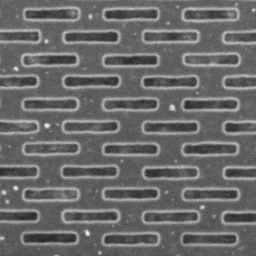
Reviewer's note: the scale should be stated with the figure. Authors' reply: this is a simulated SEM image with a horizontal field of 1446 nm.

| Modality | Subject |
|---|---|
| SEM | a regular array of holes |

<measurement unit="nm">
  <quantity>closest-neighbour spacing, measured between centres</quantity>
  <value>252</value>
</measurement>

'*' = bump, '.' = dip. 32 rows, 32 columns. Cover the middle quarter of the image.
***********.....****************
********************************
********************************
..............******............
..............******............
*.....**.....*******............
********************************
********************************
*.******************************
...*******.............*******..
...*******.............*******..
..*********..***.**************.
********************************
********************************
.............*******************
..............******............
.............*******............
********************************
********************************
********************************
...*******.............*******..
....******..............******..
**********.............*******..
********************************
********************************
********.....*******************
.............*******............
.............*******............
*********************...*.......
********************************
********************************
...*******.............*******..